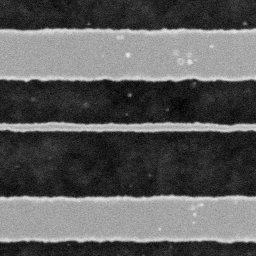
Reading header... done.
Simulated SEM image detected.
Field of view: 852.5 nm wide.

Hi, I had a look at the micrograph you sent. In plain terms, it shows lines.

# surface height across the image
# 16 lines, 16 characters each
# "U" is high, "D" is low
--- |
DDDDDDDDDDDDDDDD
DDDDDDDDDDDDDDDD
UUUUUUUUUUUUUUUU
UUUUUUUUUUUUUUUU
UUUUUUUUUUUUUUUU
DDDDDDDDDDDDDDDD
DDDDDDDDDDDDDDDD
DDDDDDDDDDDDDDDD
DDDDDDDDDDDDDDDD
DDDDDDDDDDDDDDDD
DDDDDDDDDDDDDDDD
DDDDDDDDDDDDDDDD
UUUUUUUUUUUUUUUU
UUUUUUUUUUUUUUUU
UUUUUUUUUUUUUUUU
DDDDDDDDDDDDDDDD